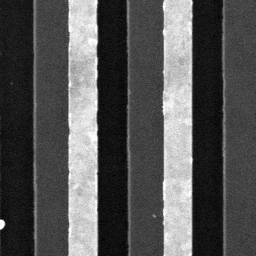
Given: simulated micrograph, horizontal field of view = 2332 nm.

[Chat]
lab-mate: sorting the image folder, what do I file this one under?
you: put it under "lines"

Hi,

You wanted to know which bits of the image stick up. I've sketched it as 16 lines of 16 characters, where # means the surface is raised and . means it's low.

..####..####..##
..####..####..##
..####..####..##
..####..####..##
..####..####..##
..####..####..##
..####..####..##
..####..####..##
..####..####..##
..####..####..##
..####..####..##
..####..####..##
..####..####..##
..####..####..##
..####..####..##
..####..####..##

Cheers